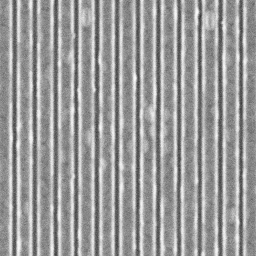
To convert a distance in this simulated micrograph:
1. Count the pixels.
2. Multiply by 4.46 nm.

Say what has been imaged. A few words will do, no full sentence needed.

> parallel lines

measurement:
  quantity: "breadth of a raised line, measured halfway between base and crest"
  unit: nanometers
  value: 66.9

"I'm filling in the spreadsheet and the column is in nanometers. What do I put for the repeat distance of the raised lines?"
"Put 91.7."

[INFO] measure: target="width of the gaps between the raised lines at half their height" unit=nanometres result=26.2